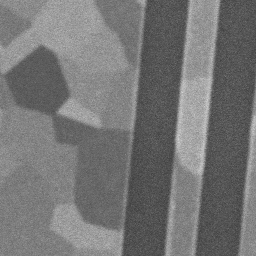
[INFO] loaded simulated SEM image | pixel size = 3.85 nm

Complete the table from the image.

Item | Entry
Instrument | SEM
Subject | one or a few lines or trenches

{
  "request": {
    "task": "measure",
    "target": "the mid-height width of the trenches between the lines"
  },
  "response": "176 nm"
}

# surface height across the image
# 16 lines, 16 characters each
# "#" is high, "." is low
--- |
#########...##..
#########...#...
#########...#...
#########...#...
#########..##...
#########..##...
########...##...
########...##...
########...##...
########...##...
########...##...
########...##..#
########...#...#
########...#...#
########...#...#
########..##...#